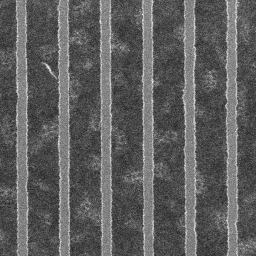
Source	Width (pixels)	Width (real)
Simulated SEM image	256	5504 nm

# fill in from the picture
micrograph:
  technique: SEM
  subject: parallel lines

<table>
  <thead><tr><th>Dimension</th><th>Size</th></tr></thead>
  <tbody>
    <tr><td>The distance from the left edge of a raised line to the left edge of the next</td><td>0.903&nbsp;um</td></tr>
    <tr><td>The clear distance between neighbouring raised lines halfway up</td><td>688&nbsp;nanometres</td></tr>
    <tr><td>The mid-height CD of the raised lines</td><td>210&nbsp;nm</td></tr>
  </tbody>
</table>